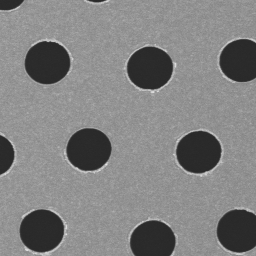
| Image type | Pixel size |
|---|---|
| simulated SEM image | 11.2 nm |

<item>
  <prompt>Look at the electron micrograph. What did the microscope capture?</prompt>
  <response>holes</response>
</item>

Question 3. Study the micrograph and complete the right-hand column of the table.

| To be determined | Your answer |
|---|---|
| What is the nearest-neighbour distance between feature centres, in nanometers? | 1070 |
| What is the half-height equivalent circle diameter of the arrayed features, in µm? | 0.488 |